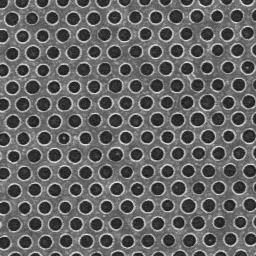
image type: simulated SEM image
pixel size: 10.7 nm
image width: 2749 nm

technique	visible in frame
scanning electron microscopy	a regular array of holes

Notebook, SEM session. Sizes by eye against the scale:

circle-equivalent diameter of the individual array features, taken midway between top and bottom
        138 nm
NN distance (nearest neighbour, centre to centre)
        210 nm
